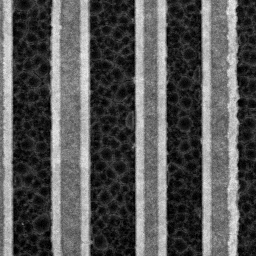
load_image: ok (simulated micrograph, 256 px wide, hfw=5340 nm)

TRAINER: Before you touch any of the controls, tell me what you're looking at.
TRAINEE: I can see one or a few lines or trenches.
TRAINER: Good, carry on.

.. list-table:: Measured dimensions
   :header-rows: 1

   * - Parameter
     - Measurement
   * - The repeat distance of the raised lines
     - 74.6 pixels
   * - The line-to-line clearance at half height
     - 0.965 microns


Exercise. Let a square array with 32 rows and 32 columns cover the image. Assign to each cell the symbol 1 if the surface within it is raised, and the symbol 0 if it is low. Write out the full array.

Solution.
10000001111000000111000000111000
10000001111000000111000000111000
10000001111000000111000000111000
10000001111000000111000000111000
10000001111000000111000000111000
10000001111000000111000000111000
10000001111000000111000000111000
10000001111000000111000000111000
10000001111000000111000000111000
10000001111000000111000000111000
10000001111000000111000000111000
10000001111000000111000000111000
10000001111000000111000000111000
10000001111000000111000000111000
10000001111000000111000000111000
10000001111000000111000000111000
10000001111000000111000000111000
10000001111000000111000000111000
10000001111000000111000000111000
10000001111000000111000000111000
10000001111000000111000000111000
10000001111000000111000000111000
10000001111000000111000000111000
10000001111000000111000000111000
10000001111000000111000000111000
10000001111000000111000000111000
10000001111000000111000000111000
10000001111000000111000000111000
10000001111000000111000000111000
10000001111000000111000000111000
10000001111000000111000000111000
10000001111000000111000000111000